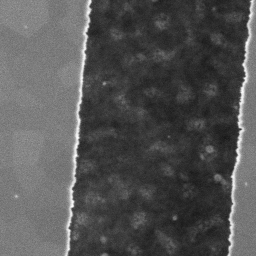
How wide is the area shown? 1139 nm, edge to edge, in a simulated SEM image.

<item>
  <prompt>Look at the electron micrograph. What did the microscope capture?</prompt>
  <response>one or a few lines or trenches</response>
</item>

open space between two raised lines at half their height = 713 nanometers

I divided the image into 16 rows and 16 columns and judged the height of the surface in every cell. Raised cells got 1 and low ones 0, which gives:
1111110000000000
1111110000000000
1111100000000001
1111100000000001
1111100000000001
1111100000000001
1111100000000001
1111100000000001
1111100000000001
1111100000000001
1111100000000001
1111100000000001
1111100000000001
1111000000000011
1111000000000011
1111000000000011